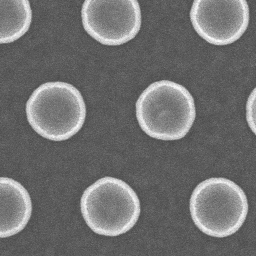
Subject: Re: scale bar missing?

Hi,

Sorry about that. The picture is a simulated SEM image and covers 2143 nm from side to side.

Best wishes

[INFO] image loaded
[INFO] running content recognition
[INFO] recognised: raised bodies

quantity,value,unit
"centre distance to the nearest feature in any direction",0.912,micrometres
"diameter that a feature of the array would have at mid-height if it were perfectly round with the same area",465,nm